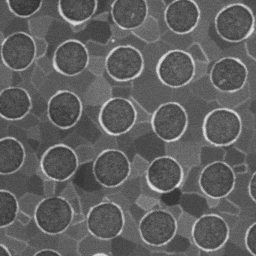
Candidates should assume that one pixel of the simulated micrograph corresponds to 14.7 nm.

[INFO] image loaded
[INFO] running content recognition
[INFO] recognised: a regular array of holes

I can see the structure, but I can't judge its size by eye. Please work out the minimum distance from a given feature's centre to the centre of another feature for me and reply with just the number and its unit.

769 nanometres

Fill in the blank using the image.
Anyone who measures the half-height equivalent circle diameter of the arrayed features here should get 510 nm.